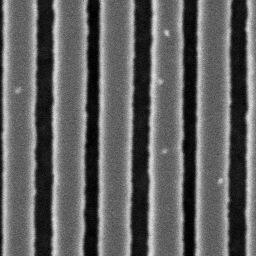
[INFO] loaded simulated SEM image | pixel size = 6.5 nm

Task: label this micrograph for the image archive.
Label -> lines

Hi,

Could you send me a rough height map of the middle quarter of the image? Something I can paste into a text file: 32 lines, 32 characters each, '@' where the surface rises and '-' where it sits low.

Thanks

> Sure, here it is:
@@@@@@---@@@@@@@@-----@@@@@@@---
@@@@@@---@@@@@@@@-----@@@@@@@@--
@@@@@@---@@@@@@@@-----@@@@@@@@--
@@@@@@---@@@@@@@@-----@@@@@@@@--
@@@@@@---@@@@@@@@-----@@@@@@@@--
@@@@@@---@@@@@@@@-----@@@@@@@@--
@@@@@@---@@@@@@@@-----@@@@@@@---
@@@@@@---@@@@@@@@-----@@@@@@@---
@@@@@----@@@@@@@@-----@@@@@@@---
@@@@@@---@@@@@@@@-----@@@@@@@@--
@@@@@----@@@@@@@@-----@@@@@@@---
@@@@@----@@@@@@@@-----@@@@@@@---
@@@@@@---@@@@@@@@-----@@@@@@@---
@@@@@@---@@@@@@@@-----@@@@@@@---
@@@@@----@@@@@@@@----@@@@@@@@@--
@@@@@----@@@@@@@@-----@@@@@@@@--
@@@@@----@@@@@@@@-----@@@@@@@@--
@@@@@----@@@@@@@@----@@@@@@@@@--
@@@@@----@@@@@@@@-----@@@@@@@@--
@@@@@----@@@@@@@@----@@@@@@@@---
@@@@@----@@@@@@@@----@@@@@@@@---
@@@@@----@@@@@@@@----@@@@@@@@---
@@@@@----@@@@@@@@-----@@@@@@@@--
@@@@@----@@@@@@@@----@@@@@@@@@--
@@@@@----@@@@@@@@----@@@@@@@@@--
@@@@@----@@@@@@@@----@@@@@@@@@--
@@@@@----@@@@@@@@----@@@@@@@@@--
@@@@@----@@@@@@@@----@@@@@@@@@--
@@@@@----@@@@@@@@-----@@@@@@@@--
@@@@@----@@@@@@@@-----@@@@@@@@--
@@@@@----@@@@@@@@----@@@@@@@@---
@@@@@----@@@@@@@@----@@@@@@@@---